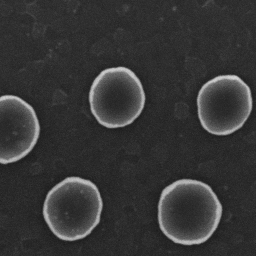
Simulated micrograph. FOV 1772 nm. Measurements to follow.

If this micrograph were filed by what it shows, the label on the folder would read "raised bodies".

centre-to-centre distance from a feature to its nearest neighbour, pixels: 110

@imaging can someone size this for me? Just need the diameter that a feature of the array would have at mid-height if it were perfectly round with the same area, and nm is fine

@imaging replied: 395